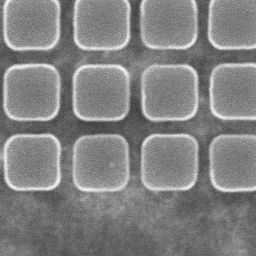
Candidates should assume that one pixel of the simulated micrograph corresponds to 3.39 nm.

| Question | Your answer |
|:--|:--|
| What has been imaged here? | raised bodies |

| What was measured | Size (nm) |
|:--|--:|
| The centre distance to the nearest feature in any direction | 233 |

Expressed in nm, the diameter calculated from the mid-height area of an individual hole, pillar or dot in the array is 203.